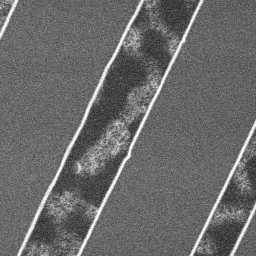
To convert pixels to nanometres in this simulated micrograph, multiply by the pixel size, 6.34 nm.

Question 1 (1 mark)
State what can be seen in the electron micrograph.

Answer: one or a few lines or trenches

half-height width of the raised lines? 351 nm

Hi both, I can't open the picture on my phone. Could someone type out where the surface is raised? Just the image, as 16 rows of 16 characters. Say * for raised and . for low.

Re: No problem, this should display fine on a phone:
*........***....
........****....
........***.....
.......****.....
.......***......
......****......
......***.......
.....****.......
.....****.......
....****.......*
....****.......*
...****.......**
...****.......**
..****.......***
..****.......**.
.****.......***.